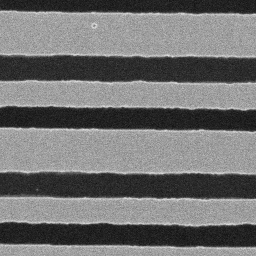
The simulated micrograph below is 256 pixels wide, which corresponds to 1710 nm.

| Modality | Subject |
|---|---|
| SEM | lines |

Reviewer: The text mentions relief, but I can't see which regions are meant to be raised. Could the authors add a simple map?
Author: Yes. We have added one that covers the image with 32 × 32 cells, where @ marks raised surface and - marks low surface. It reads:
--------------------------------
@@@-----------------------------
@@@@@@@@@@@@@@@@@@@@@@@@@@@@@@@@
@@@@@@@@@@@@@@@@@@@@@@@@@@@@@@@@
@@@@@@@@@@@@@@@@@@@@@@@@@@@@@@@@
@@@@@@@@@@@@@@@@@@@@@@@@@@@@@@@@
@@@@@@@@@@@@@@@@@@@@@@@@@@@@@@@@
--------------------------------
--------------------------------
--------------------------------
@@@@@@@@@@@@@@@@@@@@@@@@@@@@@@@@
@@@@@@@@@@@@@@@@@@@@@@@@@@@@@@@@
@@@@@@@@@@@@@@@@@@@@@@@@@@@@@@@@
-----------------------@@-@@@@@@
--------------------------------
--------------------------------
@@@@@@@@@@@@@@@@@@@@@@@@@@@@@@--
@@@@@@@@@@@@@@@@@@@@@@@@@@@@@@@@
@@@@@@@@@@@@@@@@@@@@@@@@@@@@@@@@
@@@@@@@@@@@@@@@@@@@@@@@@@@@@@@@@
@@@@@@@@@@@@@@@@@@@@@@@@@@@@@@@@
---@-------@@-@@@@@@@@@@@@@@@@@@
--------------------------------
--------------------------------
--------------------------------
@@@@@@@@@@@@@@@@@@@@@@@@@@@@@@@@
@@@@@@@@@@@@@@@@@@@@@@@@@@@@@@@@
@@@@@@@@@@@@@@@@@@@@@@@@@@@@@@@@
--------------------------------
--------------------------------
--------------------------------
@@@@@@@@@@@@@@@@@@@@@@@@@@@@@@@@